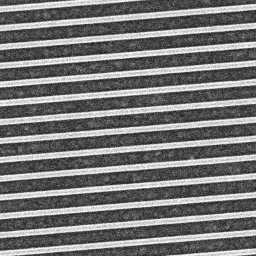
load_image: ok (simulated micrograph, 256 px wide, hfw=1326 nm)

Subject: parallel lines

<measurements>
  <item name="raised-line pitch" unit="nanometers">97.2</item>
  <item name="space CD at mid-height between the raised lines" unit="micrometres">0.0723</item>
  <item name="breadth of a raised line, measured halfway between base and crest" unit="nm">24.5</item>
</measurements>